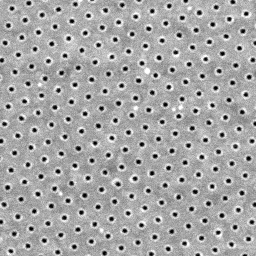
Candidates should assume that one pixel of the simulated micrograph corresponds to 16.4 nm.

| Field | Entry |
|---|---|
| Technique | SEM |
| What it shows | a regular array of holes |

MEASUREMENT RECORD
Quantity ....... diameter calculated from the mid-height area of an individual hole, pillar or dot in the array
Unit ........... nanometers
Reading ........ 96.4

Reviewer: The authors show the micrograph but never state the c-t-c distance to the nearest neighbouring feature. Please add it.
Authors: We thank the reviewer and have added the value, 285 nm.